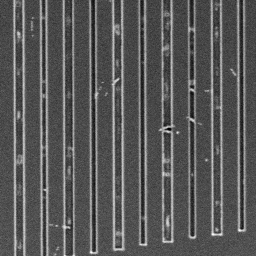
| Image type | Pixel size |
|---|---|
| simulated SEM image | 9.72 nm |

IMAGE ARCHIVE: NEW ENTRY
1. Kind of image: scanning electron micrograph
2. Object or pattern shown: parallel lines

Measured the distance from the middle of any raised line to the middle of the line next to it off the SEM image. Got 239 nm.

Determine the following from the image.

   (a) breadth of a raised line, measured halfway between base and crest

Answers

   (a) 171 nanometers